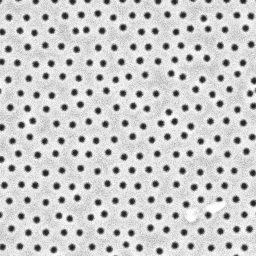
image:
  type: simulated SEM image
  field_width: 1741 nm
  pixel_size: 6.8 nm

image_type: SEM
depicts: a regular array of holes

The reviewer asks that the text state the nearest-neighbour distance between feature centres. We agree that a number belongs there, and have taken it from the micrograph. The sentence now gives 0.102 µm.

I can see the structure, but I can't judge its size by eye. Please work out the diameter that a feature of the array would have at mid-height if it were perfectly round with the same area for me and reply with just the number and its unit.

48.5 nanometres